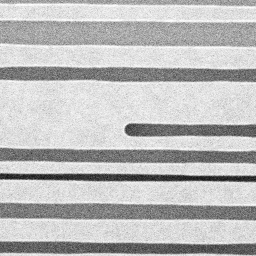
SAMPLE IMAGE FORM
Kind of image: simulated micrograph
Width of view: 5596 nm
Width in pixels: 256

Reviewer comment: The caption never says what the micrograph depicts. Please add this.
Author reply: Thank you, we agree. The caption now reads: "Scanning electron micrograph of groups of lines, slits or small figures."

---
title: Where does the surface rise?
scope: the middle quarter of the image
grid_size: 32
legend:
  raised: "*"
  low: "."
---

.*******************************
................................
................................
................................
**********......................
********************************
********************************
********************************
********************************
********************************
********************************
********************************
********************************
********************************
********************************
***************.................
***************.................
***************.................
********************************
********************************
********************************
................................
................................
................................
................................
********************************
********************************
....................************
................................
*******.......................**
********************************
********************************